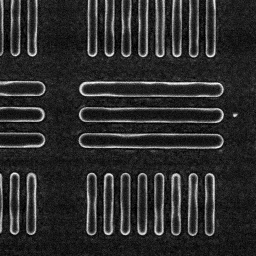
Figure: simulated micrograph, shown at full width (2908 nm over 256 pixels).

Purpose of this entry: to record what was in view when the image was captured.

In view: groups of lines, slits or small figures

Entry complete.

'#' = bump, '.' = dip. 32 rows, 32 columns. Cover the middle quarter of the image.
................................
................................
................................
................................
................................
....############################
....############################
.....###########################
................................
................................
................................
....############################
....############################
....############################
................................
................................
................................
.....####.......................
....############################
....############################
.....###########################
................................
................................
................................
................................
................................
................................
......##...#...#...#...#........
......##..##..##...##..##..##..#
......##..##..##...##..##..##...
......##..##..##...##..##..##...
......##..##..##...##..##..##...